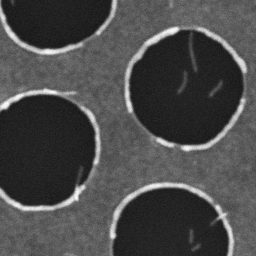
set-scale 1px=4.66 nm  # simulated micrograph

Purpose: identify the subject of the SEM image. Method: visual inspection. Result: holes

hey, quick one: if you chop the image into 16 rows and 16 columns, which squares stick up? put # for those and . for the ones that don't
.......#########
......##########
#....#####...###
#########......#
########.......#
########.......#
#....###.......#
......###.....##
......####....##
......##########
......##########
.....###########
#...####.....###
#######.......##
#######.......##
#######.......##